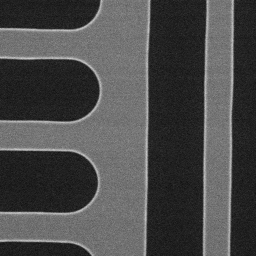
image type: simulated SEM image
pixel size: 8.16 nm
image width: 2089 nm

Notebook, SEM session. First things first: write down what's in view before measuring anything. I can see groups of lines, slits or small figures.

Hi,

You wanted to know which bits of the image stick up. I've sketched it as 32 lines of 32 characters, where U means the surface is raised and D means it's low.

DDDDDDDDDDDDDUUUUUUDDDDDDDUUUDDD
DDDDDDDDDDDDUUUUUUUDDDDDDDUUUDDD
DDDDDDDDDDDDUUUUUUUDDDDDDDUUUDDD
DDDDDDDDDDUUUUUUUUUDDDDDDDUUUDDD
UUUUUUUUUUUUUUUUUUUDDDDDDDUUUDDD
UUUUUUUUUUUUUUUUUUDDDDDDDDUUUDDD
UUUUUUUUUUUUUUUUUUDDDDDDDDUUUDDD
DDDDDDDDDDUUUUUUUUDDDDDDDDUUUDDD
DDDDDDDDDDDUUUUUUUDDDDDDDDUUUDDD
DDDDDDDDDDDDUUUUUUDDDDDDDDUUUDDD
DDDDDDDDDDDDUUUUUUDDDDDDDDUUUDDD
DDDDDDDDDDDDDUUUUUDDDDDDDDUUUDDD
DDDDDDDDDDDDUUUUUUDDDDDDDDUUUDDD
DDDDDDDDDDDDUUUUUUDDDDDDDDUUUDDD
DDDDDDDDDDDUUUUUUUDDDDDDDDUUUDDD
UUUUUUUUUUUUUUUUUUDDDDDDDDUUUDDD
UUUUUUUUUUUUUUUUUUDDDDDDDDUUUDDD
UUUUUUUUUUUUUUUUUUDDDDDDDDUUUDDD
UUUUUUUUUUUUUUUUUUDDDDDDDDUUUDDD
DDDDDDDDDDUUUUUUUUDDDDDDDDUUUDDD
DDDDDDDDDDDUUUUUUUDDDDDDDDUUUDDD
DDDDDDDDDDDDUUUUUUDDDDDDDDUUUDDD
DDDDDDDDDDDDUUUUUUDDDDDDDDUUUDDD
DDDDDDDDDDDDUUUUUUDDDDDDDDUUUDDD
DDDDDDDDDDDDUUUUUUDDDDDDDDUUUDDD
DDDDDDDDDDDUUUUUUUDDDDDDDDUUUDDD
DDDDDDDDDUUUUUUUUUDDDDDDDDUUUDDD
UUUUUUUUUUUUUUUUUUDDDDDDDDUUUDDD
UUUUUUUUUUUUUUUUUUDDDDDDDDUUUDDD
UUUUUUUUUUUUUUUUUUDDDDDDDDUUUDDD
DDDDDDDDDUUUUUUUUUDDDDDDDDUUUDDD
DDDDDDDDDDDUUUUUUUDDDDDDDUUUUDDD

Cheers